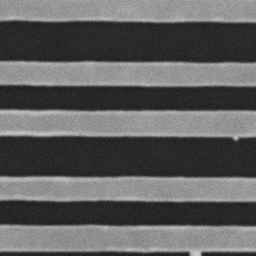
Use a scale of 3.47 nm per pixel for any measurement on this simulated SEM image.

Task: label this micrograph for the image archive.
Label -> wiring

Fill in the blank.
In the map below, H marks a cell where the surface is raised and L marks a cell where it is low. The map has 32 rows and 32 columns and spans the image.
HHHHHHHHHHHHHHHHHHHHHHHHHHHHHHHH
HHHHHHHHHHHHHHHHHHHHHHHHHHHHHHHH
HLLHHHHHHHHHHHHHHHHHHHHHHHHHHHHH
LLLLLLLLLLLLLLLLLLLLLLLLLLLLLLLL
LLLLLLLLLLLLLLLLLLLLLLLLLLLLLLLL
LLLLLLLLLLLLLLLLLLLLLLLLLLLLLLLL
LLLLLLLLLLLLLLLLLLLLLLLLLLLLLLLL
LLLLLLLLLLLLLLLLLLLLLLLLLLLLLLLL
HHHHHHHHHHHHHHHHHHHHHHHHHHHHHHHH
HHHHHHHHHHHHHHHHHHHHHHHHHHHHHHHH
HHHHHHHHHHHHHHHHHHHHHHHHHHHHHHHH
LLLLLLLLLLLLLLLLLLLLLLLLLLLLLLLL
LLLLLLLLLLLLLLLLLLLLLLLLLLLLLLLL
LLLLLLLLLLLLLLLLLLLLLLLLLLLLLLLL
HHHHHHHHHHHHHHHHHHHHHHHHHHHHHHHH
HHHHHHHHHHHHHHHHHHHHHHHHHHHHHHHH
HHHHHHHHHHHHHHHHHHHHHHHHHHHHHHHH
LLLLLLLLLLLLLLLLLLLLLLLLLLLLLLLL
LLLLLLLLLLLLLLLLLLLLLLLLLLLLLLLL
LLLLLLLLLLLLLLLLLLLLLLLLLLLLLLLL
LLLLLLLLLLLLLLLLLLLLLLLLLLLLLLLL
LLLLLLLLLLLLLLLLLLLLLLLLLLLLLLLL
HHHHHHHHHHHHHHHHHHHHHHHHHHHHHHHH
HHHHHHHHHHHHHHHHHHHHHHHHHHHHHHHH
HHHHHHHHHHHHHHHHHHHHHHHHHHHHHHHH
LLLLLLLLLLLLLLLLLLLLLLLLLLLLLLLL
LLLLLLLLLLLLLLLLLLLLLLLLLLLLLLLL
LLLLLLLLLLLLLLLLLLLLLLLLLLLLLLLL
HHHHHHHHHHHHHHHHHHHHHHHHHHHHHHHH
HHHHHHHHHHHHHHHHHHHHHHHHHHHHHHHH
HHHHHHHHHHHHHHHHHHHHHHHHHHHHHHHH
LLLLLLLLLLLLLLLLLLLLLLLHHLLLLLLL